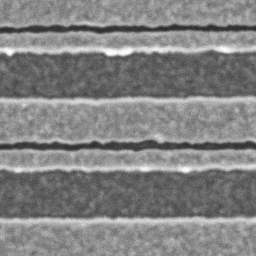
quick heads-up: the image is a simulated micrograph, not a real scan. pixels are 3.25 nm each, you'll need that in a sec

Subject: lines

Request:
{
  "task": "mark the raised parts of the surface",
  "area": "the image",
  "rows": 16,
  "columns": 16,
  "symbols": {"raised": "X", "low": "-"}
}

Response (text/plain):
XXXXXXXXXXXXXXXX
XXXXXXXXXXXXXXXX
XXXXXXXXXXXXXXXX
----------------
----------------
----------------
XXXXXXXXXXXXXXXX
XXXXXXXXXXXXXXXX
XXXXXXXXXXXXXXXX
XXXXXXXXXXXXXXXX
XXX-XXXXXXXXX---
----------------
----------------
----------------
XXXXXXXXXXXXXXXX
XXXXXXXXXXXXXXXX